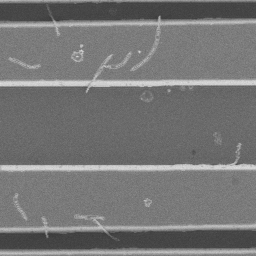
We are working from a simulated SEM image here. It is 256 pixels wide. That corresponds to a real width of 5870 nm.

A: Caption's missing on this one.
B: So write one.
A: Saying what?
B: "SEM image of lines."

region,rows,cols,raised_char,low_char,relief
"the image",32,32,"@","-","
--------------------------------
--------------------------------
-------------------@------@@@@@@
@@@@@@@@@@@@@@@@@@@@@@@@@@@@@@@@
@@@@@@@@@@@@@@@@@@@@@@@@@@@@@@@@
@@@@@@@@@@@@@@@@@@@@@@@@@@@@@@@@
@@@@@@@@@@@@@@@@@@@@@@@@@@@@@@@@
@@@@@@@@@@@@@@@@@@@@@@@@@@@@@@@@
@@@@@@@@@@@@@@@@@@@@@@@@@@@@@@@@
@@@@@@@@@@@@@@@@@@@@@@@@@@@@@@@@
@@@@@@@@@@@@-@@@@---------------
--------------------------------
--------------------------------
--------------------------------
--------------------------------
--------------------------------
--------------------------------
--------------------------------
--------------------------------
--------------------------------
--------------------------------
@@@@@@@@@@@@@@@@@@@@@@@@@@@@@@@@
@@@@@@@@@@@@@@@@@@@@@@@@@@@@@@@@
@@@@@@@@@@@@@@@@@@@@@@@@@@@@@@@@
@@@@@@@@@@@@@@@@@@@@@@@@@@@@@@@@
@@@@@@@@@@@@@@@@@@@@@@@@@@@@@@@@
@@@@@@@@@@@@@@@@@@@@@@@@@@@@@@@@
@@@@@@@@@@@@@@@@@@@@@@@@@@@@@@@@
@@@@@@@@@@@@@@@@@@@@@@@@@@@@@@@@
--------------------------------
--------------------------------
@@@@@@@@@@@@@@@@@@@@@@@@@@@@@@@@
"